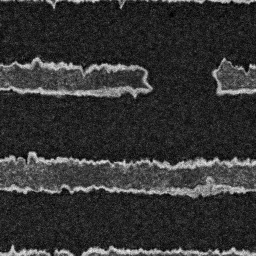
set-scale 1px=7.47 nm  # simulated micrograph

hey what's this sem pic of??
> one or a few lines or trenches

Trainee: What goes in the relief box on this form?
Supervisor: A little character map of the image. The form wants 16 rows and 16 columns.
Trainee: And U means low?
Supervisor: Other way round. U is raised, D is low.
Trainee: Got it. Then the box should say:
DDDDDDDDDDDDDDDD
DDDDDDDDDDDDDDDD
DDDDDDDDDDDDDDDD
DDDDDDDDDDDDDDDD
UUUUUUUUUDDDDDUU
UUUUUUUUUDDDDDUU
DDDDDDDDDDDDDDDD
DDDDDDDDDDDDDDDD
DDDDDDDDDDDDDDDD
DDDDDDDDDDDDDDDD
UUUUUUUUUUUUUUUU
UUUUUUUUUUUUUUUU
DDDDDDDDDDDDDDDD
DDDDDDDDDDDDDDDD
DDDDDDDDDDDDDDDD
DDDDDDDDDDDDDDDD